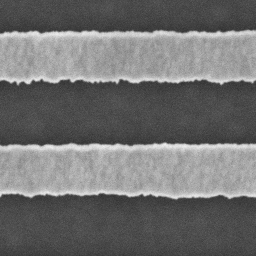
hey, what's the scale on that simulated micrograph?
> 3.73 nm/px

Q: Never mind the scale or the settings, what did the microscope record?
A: lines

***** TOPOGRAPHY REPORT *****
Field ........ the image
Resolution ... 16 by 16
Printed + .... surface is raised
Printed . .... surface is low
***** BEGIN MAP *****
................
................
++++++++++++++++
++++++++++++++++
++++++++++++++++
................
................
................
................
++++++++++++++++
++++++++++++++++
++++++++++++++++
................
................
................
................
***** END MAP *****